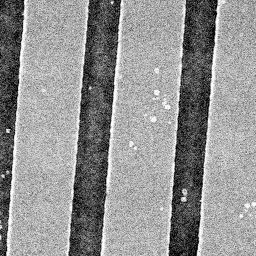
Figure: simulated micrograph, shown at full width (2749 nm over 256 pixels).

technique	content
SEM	lines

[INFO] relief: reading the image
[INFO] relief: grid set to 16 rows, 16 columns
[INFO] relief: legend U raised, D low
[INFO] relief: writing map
DDUUUUDDUUUUDDUU
DUUUUDDUUUUUDDUU
DUUUUDDUUUUDDUUU
DUUUUDDUUUUDDUUU
DUUUUDDUUUUDDUUU
DUUUUDDUUUUDDUUU
DUUUUDDUUUUDDUUU
DUUUUDDUUUUDDUUU
DUUUUDDUUUUDDUUU
DUUUUDDUUUUDDUUU
DUUUUDDUUUUDDUUU
DUUUUDDUUUUDDUUU
DUUUUDDUUUUDDUUU
DUUUDDDUUUUDDUUU
DUUUDDUUUUUDUUUU
UUUUDDUUUUUDUUUU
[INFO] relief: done